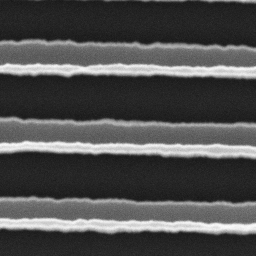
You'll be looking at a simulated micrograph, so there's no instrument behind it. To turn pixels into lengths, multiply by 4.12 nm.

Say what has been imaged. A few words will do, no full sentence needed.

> lines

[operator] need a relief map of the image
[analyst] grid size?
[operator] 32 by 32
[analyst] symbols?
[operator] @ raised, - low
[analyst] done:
--------------------------------
--------------------------------
--------------------------------
--------------------------------
--------------------------------
@@@@@@@@@@-@--------------------
@@@@@@@@@@@@@@@@@@@@@@@@@@@@@@@@
@@@@@@@@@@@@@@@@@@@@@@@@@@@@@@@@
@@@@@@@@@@@@@@@@@@@@@@@@@@@@@@@@
----------------------------@@@@
--------------------------------
--------------------------------
--------------------------------
--------------------------------
--------------------------------
@@@@@@@@@@@@@@@@@@@@@-----------
@@@@@@@@@@@@@@@@@@@@@@@@@@@@@@@@
@@@@@@@@@@@@@@@@@@@@@@@@@@@@@@@@
@@@@@@@@@@@@@@@@@@@@@@@@@@@@@@@@
---------------------------@---@
--------------------------------
--------------------------------
--------------------------------
--------------------------------
--------------------------------
@@@@@@@@@@@@@@@@@@@@@@@@@@@@@-@@
@@@@@@@@@@@@@@@@@@@@@@@@@@@@@@@@
@@@@@@@@@@@@@@@@@@@@@@@@@@@@@@@@
-----@@@@@@@@@@@@@@@@@@@@@@@@@@@
--------------------------------
--------------------------------
--------------------------------